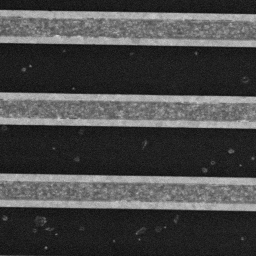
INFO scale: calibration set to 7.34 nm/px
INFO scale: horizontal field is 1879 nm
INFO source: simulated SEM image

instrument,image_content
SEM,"one or a few lines or trenches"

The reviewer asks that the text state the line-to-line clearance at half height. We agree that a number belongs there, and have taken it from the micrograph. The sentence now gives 419 nm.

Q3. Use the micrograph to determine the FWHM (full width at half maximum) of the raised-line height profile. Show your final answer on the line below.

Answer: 187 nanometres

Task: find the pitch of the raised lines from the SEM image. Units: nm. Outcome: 601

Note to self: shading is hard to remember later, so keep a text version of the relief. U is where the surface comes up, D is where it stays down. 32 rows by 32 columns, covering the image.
DDDDDDDDDDDDDDDDDDDDDDDDDDDDDDDD
DDDDDDDDDDDDDDDDDDDDDDDDDDDDDDDD
UUUUUUUUUUUUUUUUUUUUUUUUUUUUUUUU
UUUUUUUUUUUUUUUUUUUUUUUUUUUUUUUU
UUUUUUUUUUUUUUUUUUUUUUUUUUUUUUUU
DDDDDDDDDDDDDDDDDDDDDDDDDDDDDDDD
DDDDDDDDDDDDDDDDDDDDDDDDDDDDDDDD
DDDDDDDDDDDDDDDDDDDDDDDDDDDDDDDD
DDDDDDDDDDDDDDDDDDDDDDDDDDDDDDDD
DDDDDDDDDDDDDDDDDDDDDDDDDDDDDDDD
DDDDDDDDDDDDDDDDDDDDDDDDDDDDDDDD
DDDDDDDDDDDDDDDDDDDDDDDDDDDDDDDD
UUUUUUUUUUUUUUUUUUUUUUUUUDDDDDDD
UUUUUUUUUUUUUUUUUUUUUUUUUUUUUUUU
UUUUUUUUUUUUUUUUUUUUUUUUUUUUUUUU
DDDDDDDDDDDDDDDDDDDDDDDDDDDUUUUU
DDDDDDDDDDDDDDDDDDDDDDDDDDDDDDDD
DDDDDDDDDDDDDDDDDDDDDDDDDDDDDDDD
DDDDDDDDDDDDDDDDDDDDDDDDDDDDDDDD
DDDDDDDDDDDDDDDDDDDDDDDDDDDDDDDD
DDDDDDDDDDDDDDDDDDDDDDDDDDDDDDDD
DDDDDDDDDDDDDDDDDDDDDDDDDDDDDDDD
UUUUUUUUUUUUDDDDDDDDDDDDDDDDDDDD
UUUUUUUUUUUUUUUUUUUUUUUUUUUUUUUU
UUUUUUUUUUUUUUUUUUUUUUUUUUUUUUUU
DDDDDDDDDDDDDDUUUUUUUUUUUUUUUUUU
DDDDDDDDDDDDDDDDDDDDDDDDDDDDDDDD
DDDDDDDDDDDDDDDDDDDDDDDDDDDDDDDD
DDDDDDDDDDDDDDDDDDDDDDDDDDDDDDDD
DDDDDDDDDDDDDDDDDDDDDDDDDDDDDDDD
DDDDDDDDDDDDDDDDDDDDDDDDDDDDDDDD
DDDDDDDDDDDDDDDDDDDDDDDDDDDDDDDD